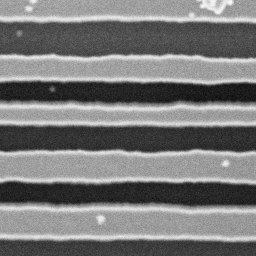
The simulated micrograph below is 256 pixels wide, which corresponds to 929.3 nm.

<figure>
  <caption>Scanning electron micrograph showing lines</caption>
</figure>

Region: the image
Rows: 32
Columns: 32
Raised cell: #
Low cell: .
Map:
################################
################################
##..##.####.........#####.######
................................
................................
................................
................................
################################
################################
################################
................................
................................
................................
################################
################################
..##############################
................................
................................
................................
################################
################################
################################
################################
................................
................................
................................
################################
################################
################################
################################
................................
................................